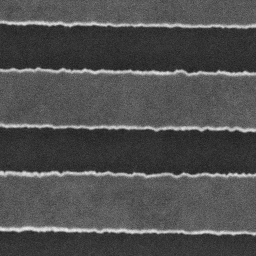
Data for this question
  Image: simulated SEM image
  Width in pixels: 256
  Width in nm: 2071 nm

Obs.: lines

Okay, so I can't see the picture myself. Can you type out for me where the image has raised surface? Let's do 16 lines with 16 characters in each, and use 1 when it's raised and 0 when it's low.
1111111111111111
1111111111111111
0000000000000000
0000000000000000
1111111111110100
1111111111111111
1111111111111111
1111111111111111
0000000000000000
0000000000000000
0000000000000000
1111111111111111
1111111111111111
1111111111111111
0000000011111111
0000000000000000